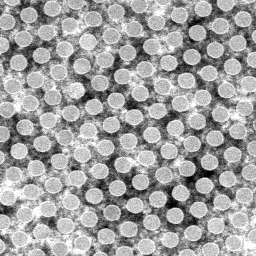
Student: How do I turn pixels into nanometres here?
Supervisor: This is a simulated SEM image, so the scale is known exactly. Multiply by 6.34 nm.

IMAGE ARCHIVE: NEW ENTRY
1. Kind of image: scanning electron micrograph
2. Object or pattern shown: a regular array of raised bodies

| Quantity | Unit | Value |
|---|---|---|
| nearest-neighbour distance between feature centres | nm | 150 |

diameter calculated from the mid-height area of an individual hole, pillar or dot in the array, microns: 0.101